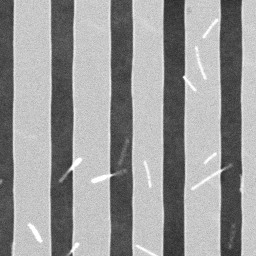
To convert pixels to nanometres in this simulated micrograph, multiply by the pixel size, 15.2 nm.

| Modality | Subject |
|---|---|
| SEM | groups of lines, slits or small figures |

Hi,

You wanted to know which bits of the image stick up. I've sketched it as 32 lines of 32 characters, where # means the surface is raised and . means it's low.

..####...#####...###...####...##
..####...#####...###...#####..##
..####...#####...###...#####..##
..####...#####...###...####...##
..####...#####...###...####...##
..####...#####...###...####...##
..####...#####...###...####...##
..####...#####...###...####...##
..####...#####...###...####...##
..####...#####...###...####...##
..####...#####...###...#####..##
..####...#####...###...#####..##
..####...#####...###...#####..##
..####...#####...###...#####..##
..####...#####...###...#####..##
..####...#####...###...####...##
..####...#####...###...#####..##
..####...#####...###...#####..##
..####...#####...###...#####..##
..####...#####...###...#####..##
..####...#####...###...#####..##
..####...#####...###...#####..##
..####...#####...###...#####..##
..####...#####...###...#####..##
..####...#####...###...#####..##
..####...#####...###...#####..##
..####...#####...###...#####..##
..####...#####...###...####...##
..####...#####...###...####...##
..####...#####...###...####...##
..####...#####...###...####...##
..####...#####...###...#####..##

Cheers